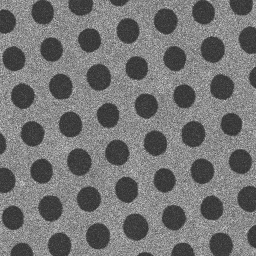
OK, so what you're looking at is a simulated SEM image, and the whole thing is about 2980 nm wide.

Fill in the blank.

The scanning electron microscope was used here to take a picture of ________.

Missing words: a regular array of holes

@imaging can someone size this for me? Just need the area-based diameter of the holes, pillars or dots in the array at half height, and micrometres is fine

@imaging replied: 0.283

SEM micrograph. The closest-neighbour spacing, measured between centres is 446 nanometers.